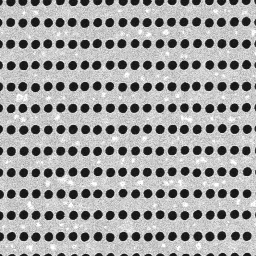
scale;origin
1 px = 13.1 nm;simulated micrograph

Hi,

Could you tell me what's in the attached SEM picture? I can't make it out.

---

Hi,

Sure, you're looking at a regular array of holes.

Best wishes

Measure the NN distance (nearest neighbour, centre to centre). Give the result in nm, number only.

157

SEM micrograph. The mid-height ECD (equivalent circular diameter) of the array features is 120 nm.